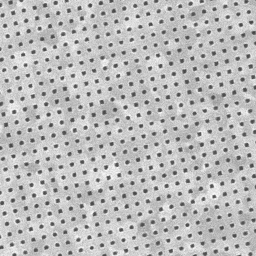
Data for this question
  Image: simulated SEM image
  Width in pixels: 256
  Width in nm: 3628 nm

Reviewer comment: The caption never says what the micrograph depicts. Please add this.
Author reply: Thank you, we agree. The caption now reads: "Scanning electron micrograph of a regular array of holes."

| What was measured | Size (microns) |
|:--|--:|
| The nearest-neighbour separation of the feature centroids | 0.15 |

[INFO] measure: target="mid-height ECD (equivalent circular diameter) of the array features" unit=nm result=69.7